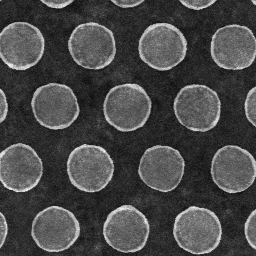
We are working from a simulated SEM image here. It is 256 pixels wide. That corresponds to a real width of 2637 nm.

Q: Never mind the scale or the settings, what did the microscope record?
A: a regular array of raised bodies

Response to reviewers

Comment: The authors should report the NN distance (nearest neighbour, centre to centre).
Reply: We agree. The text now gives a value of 724 nanometers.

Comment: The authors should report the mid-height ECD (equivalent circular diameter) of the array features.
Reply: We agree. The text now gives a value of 466 nm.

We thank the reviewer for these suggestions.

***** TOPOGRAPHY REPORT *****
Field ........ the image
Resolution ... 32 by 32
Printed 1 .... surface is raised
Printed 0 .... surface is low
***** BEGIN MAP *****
00000011000000011000000111000000
00000000000000000000000000000000
00000000000000000000000000000000
01110000001110000001110000001110
11111000011111000011111000011111
11111000011111000111111000011111
11111000011111000111111000011111
11111000001111000011111000011111
00100000000100000001100000001100
00000000000000000000000000000000
00000000000000000000000000000000
00000111100000111100000111100001
10001111110001111110001111100001
10001111110001111110001111100001
10001111110001111100001111100001
00000111100000111100000111100000
00000000000000000000000000000000
00000000000000000000000000000000
01110000001100000001110000001100
11111000011111000011111000011110
11111000011111000011111000011111
11111000011111000111111000011111
11111000011111000011111000011111
01110000001110000001110000001110
00000000000000000000000000000000
00000000000000000000000000000000
00000111100000111000000111000000
10001111100001111100001111100001
10001111110001111110001111110001
10001111110001111100001111110001
00000111100000111100001111100001
00000000000000000000000011000000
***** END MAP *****